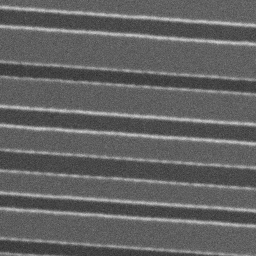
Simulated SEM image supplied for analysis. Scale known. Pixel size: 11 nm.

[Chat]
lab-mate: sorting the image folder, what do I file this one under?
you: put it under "lines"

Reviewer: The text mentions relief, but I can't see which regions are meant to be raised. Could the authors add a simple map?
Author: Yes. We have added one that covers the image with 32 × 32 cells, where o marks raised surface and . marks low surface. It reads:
oooooooooooooooooooooooooooooooo
........oooooooooooooooooooooooo
......................oooooooooo
oo..............................
ooooooooooooooooo...............
oooooooooooooooooooooooooooooooo
oooooooooooooooooooooooooooooooo
oooooooooooooooooooooooooooooooo
...........ooooooooooooooooooooo
.........................ooooooo
oooooooooooooo..................
oooooooooooooooooooooooooooo....
oooooooooooooooooooooooooooooooo
...ooooooooooooooooooooooooooooo
.................ooooooooooooooo
...............................o
oooooooooo......................
ooooooooooooooooooooooooo.......
oooooooooooooooooooooooooooooooo
............oooooooooooooooooooo
.........................ooooooo
oooo............................
ooooooooooooooooo...............
ooooooooooooooooooooooooooooooo.
......oooooooooooooooooooooooooo
....................oooooooooooo
oooooo..........................
oooooooooooooooooooo............
oooooooooooooooooooooooooooooooo
oooooooooooooooooooooooooooooooo
.........ooooooooooooooooooooooo
.......................ooooooooo